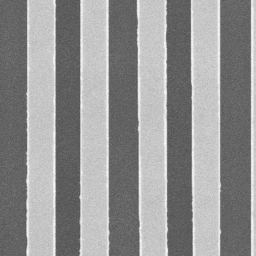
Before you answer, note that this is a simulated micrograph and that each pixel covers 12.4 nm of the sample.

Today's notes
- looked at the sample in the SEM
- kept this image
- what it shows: lines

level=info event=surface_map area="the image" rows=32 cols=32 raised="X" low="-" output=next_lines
---XXXX---XXX----XXXX---XXX----X
---XXXX---XXX----XXXX---XXX----X
---XXXX---XXX----XXXX---XXX----X
---XXXX---XXX----XXXX---XXX----X
---XXXX---XXX----XXXX---XXX----X
---XXXX---XXX----XXXX---XXX----X
---XXXX---XXX----XXXX---XXX----X
---XXXX---XXX----XXXX---XXX----X
---XXXX---XXX----XXXX---XXX----X
---XXXX---XXX----XXXX---XXX----X
---XXXX---XXX----XXXX---XXX----X
---XXXX---XXX----XXXX---XXX----X
---XXXX---XXX----XXXX---XXX----X
---XXXX---XXX----XXXX---XXX----X
---XXXX---XXX----XXXX---XXX----X
---XXXX---XXX----XXXX---XXX----X
---XXXX---XXX----XXXX---XXX----X
---XXXX---XXX----XXXX---XXX----X
---XXXX---XXX----XXXX---XXX----X
---XXXX---XXX----XXXX---XXX----X
---XXXX---XXX----XXXX---XXX----X
---XXXX---XXX----XXXX---XXX----X
---XXXX---XXX----XXXX---XXX----X
---XXXX---XXX----XXXX---XXXX---X
---XXXX---XXX----XXXX---XXX----X
---XXXX---XXX----XXXX---XXX----X
---XXXX---XXX----XXXX---XXX----X
---XXXX---XXX----XXXX---XXX----X
---XXXX---XXXX---XXXX---XXXX---X
---XXXX---XXX-----XXX---XXXX---X
---XXXX---XXXX----XXX---XXX----X
---XXXX---XXX-----XXX---XXX----X